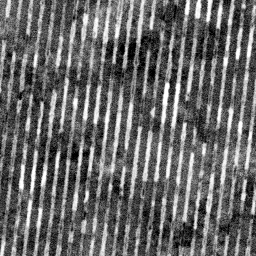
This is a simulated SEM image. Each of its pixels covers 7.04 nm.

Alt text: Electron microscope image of parallel lines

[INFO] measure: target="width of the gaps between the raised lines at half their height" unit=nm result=63.8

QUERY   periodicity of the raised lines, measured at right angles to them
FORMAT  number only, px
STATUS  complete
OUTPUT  11.1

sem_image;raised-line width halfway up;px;2.1